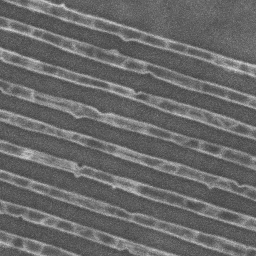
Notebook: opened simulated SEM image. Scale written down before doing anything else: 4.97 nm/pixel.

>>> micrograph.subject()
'parallel lines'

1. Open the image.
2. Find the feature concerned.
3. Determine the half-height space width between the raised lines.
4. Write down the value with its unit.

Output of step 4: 93.1 nanometers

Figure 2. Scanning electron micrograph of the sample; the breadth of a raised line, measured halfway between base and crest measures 51 nm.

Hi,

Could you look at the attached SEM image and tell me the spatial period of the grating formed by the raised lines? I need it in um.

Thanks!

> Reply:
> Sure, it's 0.145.